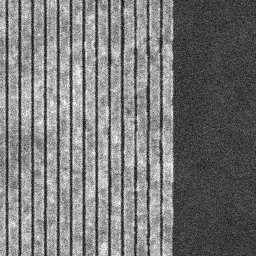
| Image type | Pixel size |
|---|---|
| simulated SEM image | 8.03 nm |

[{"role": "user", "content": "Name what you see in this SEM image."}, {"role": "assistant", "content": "parallel lines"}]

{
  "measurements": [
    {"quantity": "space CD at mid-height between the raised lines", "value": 32.1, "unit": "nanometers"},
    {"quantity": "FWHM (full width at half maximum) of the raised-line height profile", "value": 0.0713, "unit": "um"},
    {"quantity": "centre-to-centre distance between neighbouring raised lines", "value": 103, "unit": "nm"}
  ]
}